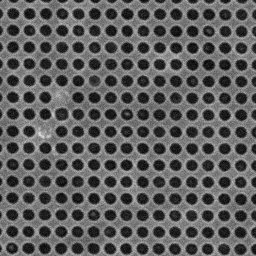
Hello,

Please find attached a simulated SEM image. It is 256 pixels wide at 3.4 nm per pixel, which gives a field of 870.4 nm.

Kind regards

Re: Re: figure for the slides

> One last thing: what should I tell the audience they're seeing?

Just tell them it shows a regular array of holes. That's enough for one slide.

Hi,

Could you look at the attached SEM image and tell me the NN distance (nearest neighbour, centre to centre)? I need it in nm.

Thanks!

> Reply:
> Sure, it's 55.1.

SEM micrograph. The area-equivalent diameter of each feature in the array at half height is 42.5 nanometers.